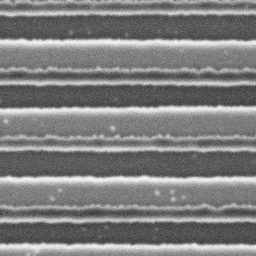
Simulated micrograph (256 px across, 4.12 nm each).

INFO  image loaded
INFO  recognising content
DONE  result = lines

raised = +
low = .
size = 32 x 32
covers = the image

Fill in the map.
++++++++++++++++++++++++++++++++
++++++++++++++++++++++++++++++++
................................
................................
................................
++++++++++++++++++++++++++++++++
++++++++++++++++++++++++++++++++
++++++++++++++++++++++++++++++++
++++++++++++++++++++++++++++++++
++++++++++++++++++++++++++++++++
......................+....+++..
................................
................................
.........+......++..++++++++++++
++++++++++++++++++++++++++++++++
++++++++++++++++++++++++++++++++
++++++++++++++++++++++++++++++++
++++++++++++++++++++++++++++++++
++++++++++++++++++++++++++++++++
................................
................................
................................
++++++++++++++++++++++++++++++++
++++++++++++++++++++++++++++++++
++++++++++++++++++++++++++++++++
++++++++++++++++++++++++++++++++
++++++++++++++++++++++++++++++++
++++++++++++++++++++++++++++++++
................................
................................
................................
++++++++++++++++++++++++++++++++